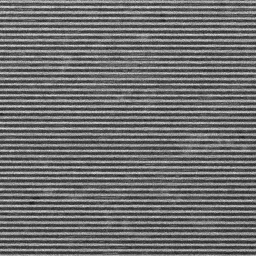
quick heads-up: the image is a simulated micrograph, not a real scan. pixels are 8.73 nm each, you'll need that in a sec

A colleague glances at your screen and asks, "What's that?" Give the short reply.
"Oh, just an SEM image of parallel lines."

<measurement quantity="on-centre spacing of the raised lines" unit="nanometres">48.2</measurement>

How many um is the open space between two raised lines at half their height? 0.0316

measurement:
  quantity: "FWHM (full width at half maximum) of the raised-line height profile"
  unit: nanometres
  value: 18.6